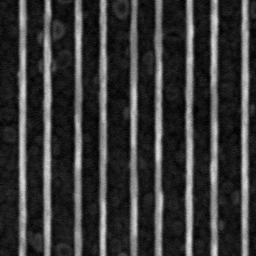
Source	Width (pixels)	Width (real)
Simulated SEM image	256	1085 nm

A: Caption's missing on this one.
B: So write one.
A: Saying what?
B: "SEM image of parallel lines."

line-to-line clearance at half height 85.9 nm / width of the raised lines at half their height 5.26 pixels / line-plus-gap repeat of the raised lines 0.118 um